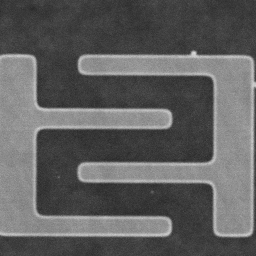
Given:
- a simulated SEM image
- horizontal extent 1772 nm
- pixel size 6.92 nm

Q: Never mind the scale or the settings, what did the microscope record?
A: groups of lines, slits or small figures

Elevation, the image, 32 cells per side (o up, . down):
................................
................................
................................
................................
................................
................................
................................
oooo......ooooooooooooooooooooo.
oooo......oooooooooooooooooooooo
oooo......................oooooo
oooo.......................ooooo
oooo.......................ooooo
oooo.......................ooooo
ooooo......................ooooo
ooooooooooooooooooooo......ooooo
ooooooooooooooooooooo......ooooo
ooooo......................ooooo
oooo.......................ooooo
oooo.......................ooooo
oooo.......................ooooo
oooo......oooooooooooooooooooooo
oooo......oooooooooooooooooooooo
oooo......oooooooooooooooooooooo
oooo.......................ooooo
oooo.......................ooooo
oooo.......................ooooo
ooooo......................ooooo
ooooooooooooooooooooo......ooooo
ooooooooooooooooooooo......ooooo
............................ooo.
................................
................................